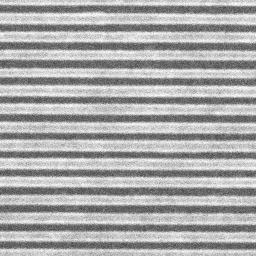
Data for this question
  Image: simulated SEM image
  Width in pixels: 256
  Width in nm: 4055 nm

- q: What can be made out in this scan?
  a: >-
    parallel lines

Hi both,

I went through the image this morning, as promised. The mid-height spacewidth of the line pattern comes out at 166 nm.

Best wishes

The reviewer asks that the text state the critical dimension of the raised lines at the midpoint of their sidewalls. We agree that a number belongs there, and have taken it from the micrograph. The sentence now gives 125 nanometres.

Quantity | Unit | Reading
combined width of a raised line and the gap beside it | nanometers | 287